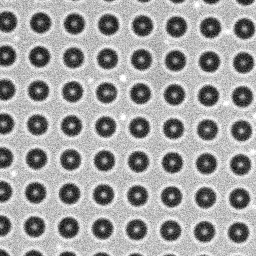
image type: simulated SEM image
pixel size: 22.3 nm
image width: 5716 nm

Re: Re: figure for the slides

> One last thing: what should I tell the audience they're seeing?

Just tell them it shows an array of small figures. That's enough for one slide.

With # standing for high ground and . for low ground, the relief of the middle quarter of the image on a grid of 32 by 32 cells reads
.....####....####.....###......#
##########..######...#####....##
################################
################################
....#####...#######.############
.....###.....####....#####....##
.....###.....###......###.....##
.....###......##...#..###..#...#
.....###.....###......###......#
#...#####...#####....####.....##
##################..######...###
################################
#..#############################
....####....#####...######...###
.....###.....###......###.....##
.....##......###......##......##
.....###.....###......##......##
....####.....###.....####.....##
#.#######..######...#####....###
################################
################################
...######..#######.#############
....####.....###.....####....###
.....##......###......##......##
.....##......###..#...##...#..##
....###......###.....###......##
...#####....#####....####.....##
##################.#######..####
################################
#.##############################
...#####....#####...######..####
....###......###.....###.....###